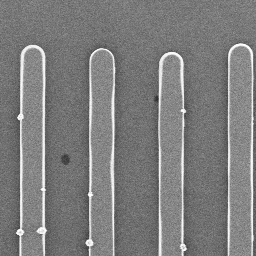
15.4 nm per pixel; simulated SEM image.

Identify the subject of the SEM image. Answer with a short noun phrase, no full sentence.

groups of lines, slits or small figures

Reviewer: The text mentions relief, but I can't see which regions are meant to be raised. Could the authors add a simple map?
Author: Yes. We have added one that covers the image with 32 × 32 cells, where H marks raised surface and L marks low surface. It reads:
LLLLLLLLLLLLLLLLLLLLLLLLLLLLLLLL
LLLLLLLLLLLLLLLLLLLLLLLLLLLLLLLL
LLLLLLLLLLLLLLLLLLLLLLLLLLLLLLLL
LLLLLLLLLLLLLLLLLLLLLLLLLLLLLLLL
LLLLLLLLLLLLLLLLLLLLLLLLLLLLLLLL
LLLLLLLLLLLLLLLLLLLLLLLLLLLLLLLL
LLLHHLLLLLLLHHLLLLLLLLLLLLLLLHHL
LLLHHLLLLLLHHHLLLLLLHHHLLLLLLHHH
LLLHHLLLLLLHHHLLLLLLHHHLLLLLLHHH
LLLHHLLLLLLHHHLLLLLLHHHLLLLLLHHH
LLLHHLLLLLLHHHLLLLLLHHHLLLLLLHHH
LLLHHLLLLLLHHHLLLLLLHHHLLLLLLHHH
LLLHHLLLLLLHHHLLLLLLHHHLLLLLLHHH
LLLHHLLLLLLHHHLLLLLLHHHLLLLLLHHH
LLHHHLLLLLLHHHLLLLLLHHHLLLLLLHHH
LLLHHLLLLLLHHHLLLLLLHHHLLLLLLHHH
LLLHHLLLLLLHHHLLLLLLHHHLLLLLLHHH
LLLHHLLLLLLHHHLLLLLLHHHLLLLLLHHH
LLLHHLLLLLLHHHLLLLLLHHHLLLLLLHHL
LLLHHLLLLLLHHHLLLLLLHHHLLLLLLHHL
LLLHHLLLLLLHHHLLLLLLHHHLLLLLLHHL
LLLHHLLLLLLHHHLLLLLLHHHLLLLLLHHL
LLLHHLLLLLLHHHLLLLLLHHHLLLLLLHHL
LLLHHHLLLLLHHHLLLLLLHHHLLLLLLHHH
LLLHHLLLLLLHHHLLLLLLHHHLLLLLLHHH
LLLHHLLLLLLHHHLLLLLLHHHLLLLLLHHH
LLLHHLLLLLLHHHLLLLLLHHHLLLLLLHHH
LLLHHLLLLLLHHHLLLLLLHHHLLLLLLHHH
LLHHHHLLLLLHHHLLLLLLHHHLLLLLLHHH
LLHHHLLLLLLHHHLLLLLLHHHLLLLLLHHH
LLLHHLLLLLLHHHLLLLLLHHHLLLLLLHHH
LLLHHLLLLLLHHHLLLLLLHHHLLLLLLHHH